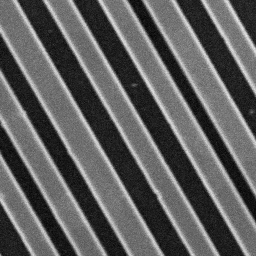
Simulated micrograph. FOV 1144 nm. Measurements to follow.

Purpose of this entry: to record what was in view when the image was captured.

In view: parallel lines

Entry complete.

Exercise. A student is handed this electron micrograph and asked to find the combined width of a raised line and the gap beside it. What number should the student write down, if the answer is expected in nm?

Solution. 208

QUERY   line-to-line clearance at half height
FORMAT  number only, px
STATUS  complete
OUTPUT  25.1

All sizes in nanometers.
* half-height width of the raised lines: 100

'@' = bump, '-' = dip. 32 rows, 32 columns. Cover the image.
@@----@@@----@@@--@@@@----@@@---
@@@----@@@---@@@---@@@----@@@---
@@@----@@@----@@@--@@@@----@@@--
@@@@----@@@----@@@--@@@@---@@@--
@@@@----@@@----@@@---@@@----@@@-
-@@@@----@@@----@@@--@@@@----@@-
--@@@@---@@@----@@@---@@@----@@@
--@@@@----@@@----@@@--@@@@----@@
---@@@@----@@@---@@@@--@@@@---@@
---@@@@----@@@----@@@--@@@@----@
@---@@@@----@@@----@@@--@@@@---@
@----@@@@---@@@----@@@---@@@----
@@---@@@@----@@@----@@@--@@@@---
@@@---@@@@---@@@@---@@@---@@@---
@@@---@@@@----@@@----@@@--@@@@--
@@@@---@@@@----@@@---@@@@--@@@@-
-@@@---@@@@----@@@----@@@---@@@-
--@@@---@@@@----@@@----@@@--@@@@
--@@@----@@@----@@@----@@@---@@@
---@@@---@@@@----@@@----@@@--@@@
@--@@@@---@@@@---@@@@---@@@---@@
@---@@@---@@@@----@@@----@@@--@@
@@---@@@---@@@@----@@@---@@@@--@
@@---@@@---@@@@----@@@----@@@---
@@@---@@@---@@@@----@@@----@@@--
@@@---@@@----@@@----@@@@---@@@--
-@@@---@@@---@@@@----@@@----@@@-
--@@@--@@@@---@@@@---@@@@---@@@-
--@@@---@@@---@@@@----@@@----@@@
---@@@---@@@---@@@@----@@@----@@
---@@@---@@@---@@@@----@@@----@@
----@@@---@@@---@@@@----@@@----@